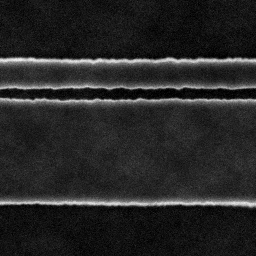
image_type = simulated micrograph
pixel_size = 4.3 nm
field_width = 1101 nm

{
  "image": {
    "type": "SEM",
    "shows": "lines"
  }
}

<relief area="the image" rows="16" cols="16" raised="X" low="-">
----------------
----------------
----------------
----------------
XXXXXXXXXXXXXXXX
XXXXXXXXXXXXXXXX
XXXXXXXXXXXXXXXX
XXXXXXXXXXXXXXXX
XXXXXXXXXXXXXXXX
XXXXXXXXXXXXXXXX
XXXXXXXXXXXXXXXX
XXXXXXXXXXXXXXXX
XXXXXXXXXXXXXXXX
----------------
----------------
----------------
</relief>